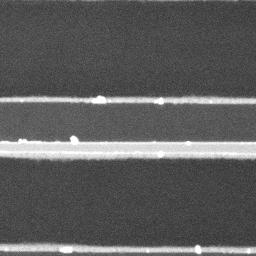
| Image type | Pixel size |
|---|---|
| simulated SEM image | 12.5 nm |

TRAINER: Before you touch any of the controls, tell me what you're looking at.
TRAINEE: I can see lines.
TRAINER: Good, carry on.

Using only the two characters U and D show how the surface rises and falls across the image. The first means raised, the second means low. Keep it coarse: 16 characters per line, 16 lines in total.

DDDDDDDDDDDDDDDD
DDDDDDDDDDDDDDDD
DDDDDDDDDDDDDDDD
DDDDDDDDDDDDDDDD
DDDDDDDDDDDDDDDD
DDDDDDDDDDDDDDDD
UUUUUUUUUUUUUUUU
UUUUUUUUUUUUUUUU
UUUUUUUUUUUUUUUU
UUUUUUUUUUUUUUUU
DDDDDDDDDDDDDDDD
DDDDDDDDDDDDDDDD
DDDDDDDDDDDDDDDD
DDDDDDDDDDDDDDDD
DDDDDDDDDDDDDDDD
DDDDDDDDDDDDDDDD